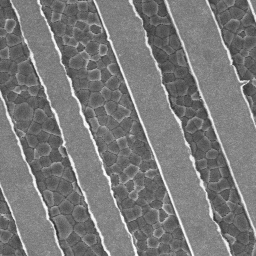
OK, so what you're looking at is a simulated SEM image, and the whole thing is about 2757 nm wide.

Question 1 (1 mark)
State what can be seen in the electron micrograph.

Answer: one or a few lines or trenches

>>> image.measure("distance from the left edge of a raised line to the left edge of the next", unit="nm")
838